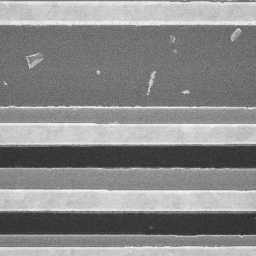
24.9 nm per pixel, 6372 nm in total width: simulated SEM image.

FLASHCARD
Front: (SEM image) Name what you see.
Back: lines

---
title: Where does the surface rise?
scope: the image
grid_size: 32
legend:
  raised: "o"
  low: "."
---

oooooooooooooooooooooooooooooooo
oooooooooooooooooooooooooooooooo
oooooooooooooooooooooooooooooooo
................................
................................
................................
................................
................................
................................
................................
................................
................................
................................
oo....ooooo.o...................
oooooooooooooooooooooooooooooooo
oooooooooooooooooooooooooooooooo
oooooooooooooooooooooooooooooooo
oooooooooooooooooooooooooooooooo
................................
................................
................................
oooooooooooooooooooooooooooooooo
oooooooooooooooooooooooooooooooo
oooooooooooooooooooooooooooooooo
oooooooooooooooooooooooooooooooo
oooooooooooooooooooooooooooooooo
................................
................................
................................
ooooooooooooooooooooooo.oooooooo
oooooooooooooooooooooooooooooooo
oooooooooooooooooooooooooooooooo